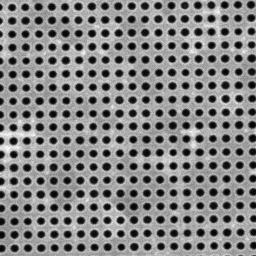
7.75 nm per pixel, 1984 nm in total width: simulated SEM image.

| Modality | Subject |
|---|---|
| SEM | a regular array of holes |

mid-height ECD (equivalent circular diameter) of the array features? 64.8 nm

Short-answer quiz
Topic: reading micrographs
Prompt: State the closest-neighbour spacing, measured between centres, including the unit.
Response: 0.0999 microns